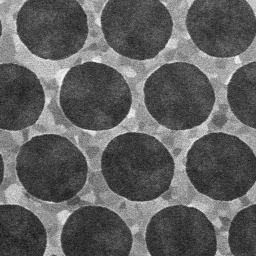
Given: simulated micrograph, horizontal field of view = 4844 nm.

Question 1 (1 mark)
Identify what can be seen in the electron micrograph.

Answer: holes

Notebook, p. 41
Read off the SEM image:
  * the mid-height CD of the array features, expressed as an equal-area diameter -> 1310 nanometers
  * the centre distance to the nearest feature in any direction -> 1540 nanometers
